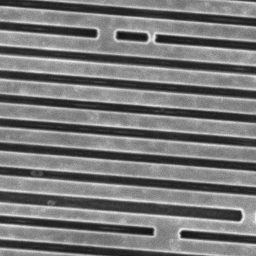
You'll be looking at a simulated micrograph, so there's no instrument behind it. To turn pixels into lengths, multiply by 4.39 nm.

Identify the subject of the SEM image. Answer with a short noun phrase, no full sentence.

parallel lines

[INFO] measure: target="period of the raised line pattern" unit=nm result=106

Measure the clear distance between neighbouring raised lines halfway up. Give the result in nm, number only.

38.3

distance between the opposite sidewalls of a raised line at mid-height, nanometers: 68.9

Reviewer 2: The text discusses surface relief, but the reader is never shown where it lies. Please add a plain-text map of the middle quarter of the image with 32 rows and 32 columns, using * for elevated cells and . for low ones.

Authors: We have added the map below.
*******************.............
*******************************.
********************************
..........**********************
......................**********
*****.**........................
*****************...............
********************************
********************************
........************************
....................************
******..........................
******************..............
*******************************.
********************************
.........***********************
.....................***********
*******.........................
*******************.............
********************************
********************************
.........***********************
....................*.**********
*****...........................
******************..............
******************************..
********************************
........************************
.....................***********
****............................
****************................
****************************....